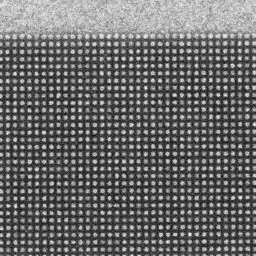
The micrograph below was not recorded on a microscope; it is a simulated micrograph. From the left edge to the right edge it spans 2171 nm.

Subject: a regular array of raised bodies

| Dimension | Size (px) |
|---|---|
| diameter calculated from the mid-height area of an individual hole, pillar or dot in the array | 3.9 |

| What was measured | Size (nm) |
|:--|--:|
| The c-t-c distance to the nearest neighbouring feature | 57.7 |